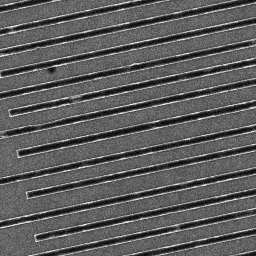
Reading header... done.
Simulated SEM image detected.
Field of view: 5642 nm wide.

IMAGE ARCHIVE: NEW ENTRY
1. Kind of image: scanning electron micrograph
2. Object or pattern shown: parallel lines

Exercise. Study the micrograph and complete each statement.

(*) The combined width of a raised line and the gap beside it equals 457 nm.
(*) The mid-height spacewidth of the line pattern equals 13.6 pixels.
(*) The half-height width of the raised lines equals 162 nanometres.